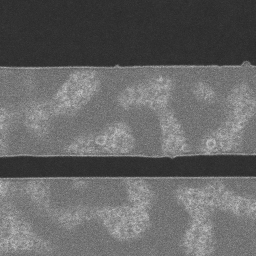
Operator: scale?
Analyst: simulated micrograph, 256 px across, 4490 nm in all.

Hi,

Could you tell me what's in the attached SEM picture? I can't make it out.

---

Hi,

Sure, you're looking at one or a few lines or trenches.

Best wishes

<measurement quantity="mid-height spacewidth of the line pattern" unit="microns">1.55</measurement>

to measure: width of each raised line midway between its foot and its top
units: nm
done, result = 397